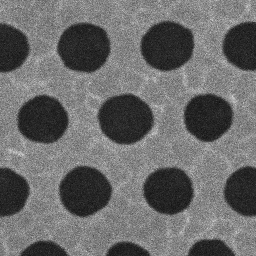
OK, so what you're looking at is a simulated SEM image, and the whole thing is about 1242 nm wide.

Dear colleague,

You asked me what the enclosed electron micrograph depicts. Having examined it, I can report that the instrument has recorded holes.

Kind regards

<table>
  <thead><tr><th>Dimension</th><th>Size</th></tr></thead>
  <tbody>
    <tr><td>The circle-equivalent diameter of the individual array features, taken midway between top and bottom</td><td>0.248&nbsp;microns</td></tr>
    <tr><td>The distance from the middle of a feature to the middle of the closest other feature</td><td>82.5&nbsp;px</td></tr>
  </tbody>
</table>